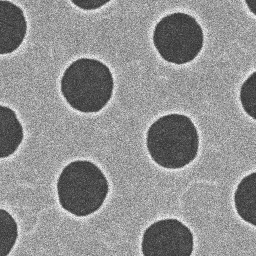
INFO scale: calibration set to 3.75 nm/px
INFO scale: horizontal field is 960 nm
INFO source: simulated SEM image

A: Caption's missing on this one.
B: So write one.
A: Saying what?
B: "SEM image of holes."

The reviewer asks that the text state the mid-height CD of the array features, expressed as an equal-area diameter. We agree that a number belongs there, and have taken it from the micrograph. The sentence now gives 200 nm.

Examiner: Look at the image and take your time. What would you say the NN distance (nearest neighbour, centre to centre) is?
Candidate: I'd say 383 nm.